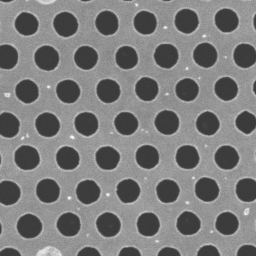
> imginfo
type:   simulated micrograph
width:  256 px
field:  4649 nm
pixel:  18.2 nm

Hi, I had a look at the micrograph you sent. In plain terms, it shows a regular array of holes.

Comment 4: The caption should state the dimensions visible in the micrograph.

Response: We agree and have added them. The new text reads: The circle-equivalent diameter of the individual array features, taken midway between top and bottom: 0.438 µm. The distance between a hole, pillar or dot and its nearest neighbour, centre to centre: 698 nanometers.